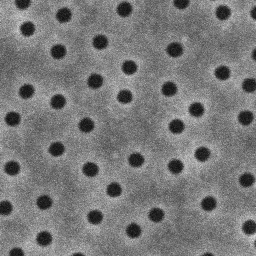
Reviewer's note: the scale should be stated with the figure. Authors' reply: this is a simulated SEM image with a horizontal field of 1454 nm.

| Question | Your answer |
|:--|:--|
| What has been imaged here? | a regular array of holes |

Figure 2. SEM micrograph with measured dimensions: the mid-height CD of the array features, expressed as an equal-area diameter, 95.8 nm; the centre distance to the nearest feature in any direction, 0.194 microns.